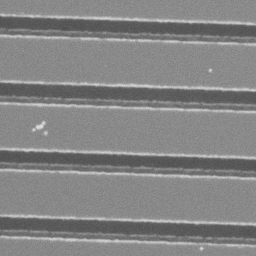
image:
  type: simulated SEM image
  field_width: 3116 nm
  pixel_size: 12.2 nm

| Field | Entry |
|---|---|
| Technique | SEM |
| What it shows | lines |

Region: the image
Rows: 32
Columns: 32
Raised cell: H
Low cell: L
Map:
HHHHHHHHHHHHHHHHHHHHHHHHHHHHHHHH
HHHHHHHHHHHHHHHHHHHHHHHHHHHHHHHH
LLLLLLLLLLLLLLLHHHHHHHHHHHHHHHHH
LLLLLLLLLLLLLLLLLLLLLLLLLLLLLLLL
HHHLLLLLLLLLLLLLLLLLLLLLLLLLLLLL
HHHHHHHHHHHHHHHHHHHHHHHHHHHHHHLL
HHHHHHHHHHHHHHHHHHHHHHHHHHHHHHHH
HHHHHHHHHHHHHHHHHHHHHHHHHHHHHHHH
HHHHHHHHHHHHHHHHHHHHHHHHHHHHHHHH
HHHHHHHHHHHHHHHHHHHHHHHHHHHHHHHH
LLLLLLLLLHLHHHHHHHHHHHHHHHHHHHHH
LLLLLLLLLLLLLLLLLLLLLLLLLLLLLLLL
LLLLLLLLLLLLLLLLLLLLLLLLLLLLLLLL
HHHHHHHHHHHHHHHHHHHLLLLLLLLLLLLL
HHHHHHHHHHHHHHHHHHHHHHHHHHHHHHHH
HHHHHHHHHHHHHHHHHHHHHHHHHHHHHHHH
HHHHHHHHHHHHHHHHHHHHHHHHHHHHHHHH
HHHHHHHHHHHHHHHHHHHHHHHHHHHHHHHH
HHHHHHHHHHHHHHHHHHHHHHHHHHHHHHHH
LLLLLLLLLLLLLLLLLLLLLLLHHHHHHHHH
LLLLLLLLLLLLLLLLLLLLLLLLLLLLLLLL
HHHHHHHHHHLLLLLLLLLLLLLLLLLLLLLL
HHHHHHHHHHHHHHHHHHHHHHHHHHHHHHHH
HHHHHHHHHHHHHHHHHHHHHHHHHHHHHHHH
HHHHHHHHHHHHHHHHHHHHHHHHHHHHHHHH
HHHHHHHHHHHHHHHHHHHHHHHHHHHHHHHH
HHHHHHHHHHHHHHHHHHHHHHHHHHHHHHHH
LLLLLLLLLLLLLLHHHHHHHHHHHHHHHHHH
LLLLLLLLLLLLLLLLLLLLLLLLLLLLLLLL
LLLLLLLLLLLLLLLLLLLLLLLLLLLLLLLL
HHHHHHHHHHHHHHHHHHHHHHHHHHHLLLLL
HHHHHHHHHHHHHHHHHHHHHHHHHHHHHHHH